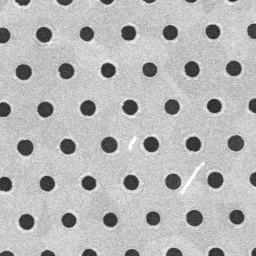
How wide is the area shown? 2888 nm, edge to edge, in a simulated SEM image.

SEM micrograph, a regular array of holes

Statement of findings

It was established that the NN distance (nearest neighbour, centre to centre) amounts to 0.473 micrometres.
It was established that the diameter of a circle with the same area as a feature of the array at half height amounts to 179 nanometres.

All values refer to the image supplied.